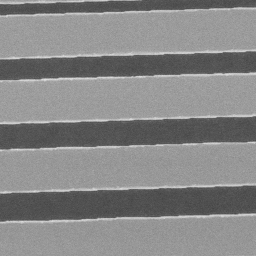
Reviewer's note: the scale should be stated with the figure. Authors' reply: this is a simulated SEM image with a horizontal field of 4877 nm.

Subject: lines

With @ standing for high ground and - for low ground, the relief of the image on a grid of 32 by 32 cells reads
--------------------------------
----------------@@@@@@@@@@@@@@@@
@@@@@@@@@@@@@@@@@@@@@@@@@@@@@@@@
@@@@@@@@@@@@@@@@@@@@@@@@@@@@@@@@
@@@@@@@@@@@@@@@@@@@@@@@@@@@@@@@@
@@@@@@@@@@@@@@@@@@@@@@@@@@@@@@@@
@@@@@@@@@@@@@@@@@@@@@@@@@@@@----
--------------------------------
--------------------------------
--------------------@@@@@@@@@@@@
@@@@@@@@@@@@@@@@@@@@@@@@@@@@@@@@
@@@@@@@@@@@@@@@@@@@@@@@@@@@@@@@@
@@@@@@@@@@@@@@@@@@@@@@@@@@@@@@@@
@@@@@@@@@@@@@@@@@@@@@@@@@@@@@@@@
@@@@@@@@@@@@@@@@@@@@@@@@@@@@@@@@
--------------------------------
--------------------------------
--------------------------------
-------@@@@@@@@@@@@@@@@@@@@@@@@@
@@@@@@@@@@@@@@@@@@@@@@@@@@@@@@@@
@@@@@@@@@@@@@@@@@@@@@@@@@@@@@@@@
@@@@@@@@@@@@@@@@@@@@@@@@@@@@@@@@
@@@@@@@@@@@@@@@@@@@@@@@@@@@@@@@@
@@@@@@@@@@@@@@@@@@@@------------
--------------------------------
--------------------------------
--------------------------------
----------@@@@@@@@@@@@@@@@@@@@@@
@@@@@@@@@@@@@@@@@@@@@@@@@@@@@@@@
@@@@@@@@@@@@@@@@@@@@@@@@@@@@@@@@
@@@@@@@@@@@@@@@@@@@@@@@@@@@@@@@@
@@@@@@@@@@@@@@@@@@@@@@@@@@@@@@@@